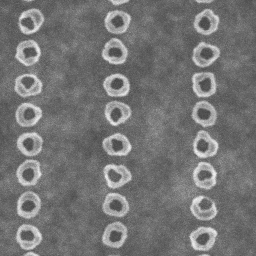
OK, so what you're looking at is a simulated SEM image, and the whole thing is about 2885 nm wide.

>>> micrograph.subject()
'a regular array of ring-shaped raised bodies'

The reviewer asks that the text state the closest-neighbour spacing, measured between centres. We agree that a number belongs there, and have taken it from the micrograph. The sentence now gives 327 nanometres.